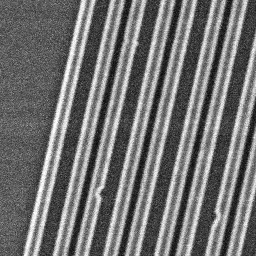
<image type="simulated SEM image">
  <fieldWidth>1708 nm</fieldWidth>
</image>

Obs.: parallel lines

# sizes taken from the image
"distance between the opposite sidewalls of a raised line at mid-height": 65.8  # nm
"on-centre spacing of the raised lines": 166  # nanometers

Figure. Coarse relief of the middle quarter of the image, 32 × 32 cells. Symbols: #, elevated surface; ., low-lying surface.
.###....###...##.....###...##...
.##.....###...##.....##...###...
.##.....###..###.....##...###...
###.....##...###....###...##....
###.....##...##.....###...##....
##......##...##.....###..###....
##.....###...##.....##...###....
##.....##...###....###...##.....
##.....##...###....###...##.....
#.....###...##.....###..###.....
#.....###...##.....##...###.....
#.....##...###.....##...##.....#
#.....##...###....###...##.....#
#....###...##.....###...##.....#
.....###...##.....###..###.....#
.....##....##.....##...###....##
.....##...###.....##...##.....##
.....##...##.....###...##.....##
....###...##.....###..###.....##
....###...##.....##...###.....##
....##...###.....##...##.....###
....##...###....###...##.....###
...###...##.....###...##.....##.
...###...##.....##...###.....##.
...##...###.....##...###....###.
...##...###....###...##.....###.
...##...##.....###...##.....##..
..###...##.....##...###.....##..
..###...##.....##...###.....##..
..##...###....###...##.....###..
..##...###....###...##.....###..
..##...##.....##...###.....##...